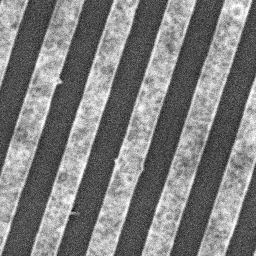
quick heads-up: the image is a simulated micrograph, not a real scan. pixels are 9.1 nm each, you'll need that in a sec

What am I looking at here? parallel lines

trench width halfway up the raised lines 262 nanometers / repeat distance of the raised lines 485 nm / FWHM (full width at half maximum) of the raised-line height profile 223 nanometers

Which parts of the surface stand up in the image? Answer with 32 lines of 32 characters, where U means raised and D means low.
UUUDDDDUUUDDDDUUUDDDDUUUDDDDUUUD
UUUDDDDUUUDDDDUUUDDDDUUUDDDDUUUD
UUUDDDUUUUDDDUUUUDDDUUUUDDDUUUUD
UUDDDDUUUDDDDUUUDDDDUUUDDDDUUUDD
UUDDDDUUUDDDDUUUDDDDUUUDDDDUUUDD
UUDDDUUUUDDDUUUUDDDUUUUDDDUUUUDD
UDDDDUUUDDDDUUUDDDDUUUDDDDUUUDDD
UDDDDUUUDDDDUUUDDDDUUUDDDDUUUDDD
UDDDUUUUDDDUUUUDDDDUUUDDDUUUUDDD
DDDDUUUDDDDUUUDDDDUUUDDDDUUUDDDD
DDDDUUUDDDDUUUDDDDUUUDDDDUUUDDDD
DDDDUUUDDDDUUUDDDUUUUDDDUUUUDDDU
DDDUUUDDDDUUUDDDDUUUDDDDUUUDDDDU
DDDUUUDDDDUUUDDDDUUUDDDDUUUDDDDU
DDUUUUDDDDUUUDDDUUUUDDDUUUUDDDUU
DDUUUDDDDUUUDDDDUUUDDDDUUUDDDDUU
DDUUUDDDDUUUDDDDUUUDDDDUUUDDDDUU
DUUUUDDDDUUUDDDDUUUDDDUUUUDDDUUU
DUUUDDDDUUUDDDDUUUDDDDUUUUDDDUUU
DUUUDDDDUUUDDDDUUUDDDDUUUDDDDUUU
DUUUDDDDUUUDDDUUUUDDDDUUUDDDDUUU
UUUUDDDUUUDDDDUUUUDDDUUUDDDDUUUU
UUUDDDDUUUDDDDUUUDDDDUUUDDDDUUUD
UUUDDDDUUUDDDDUUUDDDDUUUDDDDUUUD
UUDDDDUUUDDDDUUUDDDDUUUDDDDUUUUD
UUDDDDUUUDDDDUUUDDDDUUUDDDDUUUDD
UUDDDDUUUDDDDUUUDDDDUUUDDDUUUUDD
UDDDDUUUDDDDUUUDDDDUUUDDDDUUUUDD
UDDDDUUUDDDDUUUDDDDUUUDDDDUUUDDD
UDDDDUUUDDDUUUUDDDUUUUDDDDUUUDDD
UDDDUUUDDDDUUUUDDDUUUUDDDUUUDDDD
DDDDUUUDDDDUUUDDDDUUUDDDDUUUDDDD